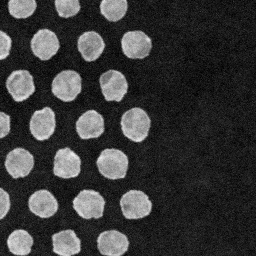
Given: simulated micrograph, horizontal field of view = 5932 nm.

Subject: a regular array of raised bodies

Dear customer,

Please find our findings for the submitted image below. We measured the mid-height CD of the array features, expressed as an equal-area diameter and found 0.641 microns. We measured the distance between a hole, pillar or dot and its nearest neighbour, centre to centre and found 45.3 pixels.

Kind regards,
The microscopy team